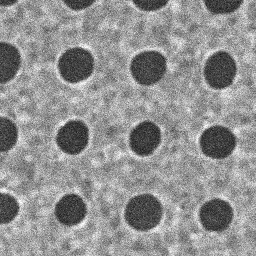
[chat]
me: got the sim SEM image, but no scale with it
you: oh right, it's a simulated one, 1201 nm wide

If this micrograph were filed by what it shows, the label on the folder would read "a regular array of holes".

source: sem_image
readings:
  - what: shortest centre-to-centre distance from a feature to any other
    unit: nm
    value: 338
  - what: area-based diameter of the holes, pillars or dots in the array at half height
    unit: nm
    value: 170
